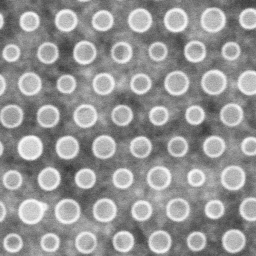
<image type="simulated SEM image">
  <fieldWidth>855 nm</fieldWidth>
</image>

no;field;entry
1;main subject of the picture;a regular array of raised bodies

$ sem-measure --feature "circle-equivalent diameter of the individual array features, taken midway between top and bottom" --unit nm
65.9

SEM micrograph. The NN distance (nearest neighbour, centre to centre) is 121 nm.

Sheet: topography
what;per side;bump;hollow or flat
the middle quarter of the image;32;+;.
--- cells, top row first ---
................................
................................
...........................+++..
++......++++......+++.....+++++.
+++....+++++.....++++....++++++.
+++....+++++.....++++....++++++.
++......++++......+++.....++++..
................................
................................
................................
.....+..........................
...+++++.....+++......+++......+
...+++++....+++++.....++++.....+
...+++++....+++++.....++++.....+
...+++++.....+++......+++.......
....+...........................
................................
................................
++......+++........+............
+++.....++++.....++++......+++..
+++....++++++....+++++....+++++.
+++....+++++.....++++.....++++..
+++.....++++.....++++......+++..
................................
................................
................................
..............+.......+++.......
...++++......++++....+++++.....+
...++++......++++....+++++.....+
...++++......++++....+++++.....+
....+++......+++......+++.......
................................